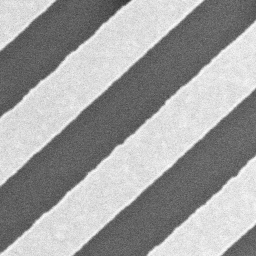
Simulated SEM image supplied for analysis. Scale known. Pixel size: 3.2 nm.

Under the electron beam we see lines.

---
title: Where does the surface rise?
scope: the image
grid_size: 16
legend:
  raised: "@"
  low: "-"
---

@@@-----@@@@----
@@-----@@@@-----
@----@@@@@-----@
----@@@@@-----@@
---@@@@@-----@@@
--@@@@@----@@@@@
-@@@@@----@@@@@-
@@@@@----@@@@@--
@@@-----@@@@@---
@@-----@@@@@----
@-----@@@@@----@
-----@@@@-----@@
----@@@@-----@@@
---@@@@-----@@@@
--@@@@-----@@@@-
-@@@@-----@@@@--